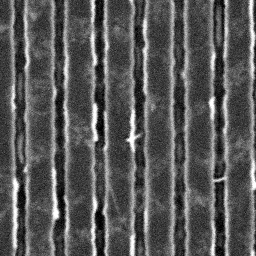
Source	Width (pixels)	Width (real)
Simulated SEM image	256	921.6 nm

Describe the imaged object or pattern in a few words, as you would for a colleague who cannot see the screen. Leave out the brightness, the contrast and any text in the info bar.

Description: parallel lines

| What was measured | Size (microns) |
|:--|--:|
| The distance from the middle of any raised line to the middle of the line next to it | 0.143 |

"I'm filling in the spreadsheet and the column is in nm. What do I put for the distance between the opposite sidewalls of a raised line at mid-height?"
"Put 108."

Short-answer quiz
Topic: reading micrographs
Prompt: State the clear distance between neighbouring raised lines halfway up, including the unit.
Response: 36 nm